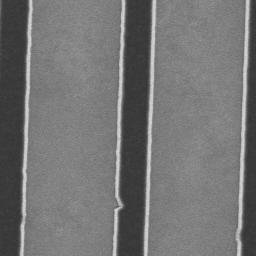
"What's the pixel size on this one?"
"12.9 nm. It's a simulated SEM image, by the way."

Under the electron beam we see one or a few lines or trenches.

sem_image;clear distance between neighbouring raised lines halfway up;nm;1190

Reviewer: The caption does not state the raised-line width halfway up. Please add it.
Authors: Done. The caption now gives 0.413 micrometres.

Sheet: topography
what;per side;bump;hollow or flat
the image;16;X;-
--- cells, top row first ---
XX------XX-----X
XX------XX-----X
XX------XX-----X
XX------XX-----X
XX------XX-----X
XX------X------X
XX-----XX------X
XX-----XX------X
XX-----XX------X
XX-----XX------X
XX-----XX------X
XX-----XX------X
XX-----XX------X
XX-----XX------X
X------XX------X
X------XX------X